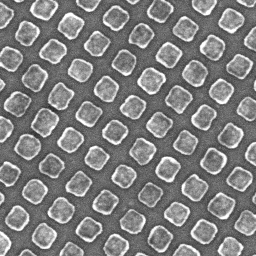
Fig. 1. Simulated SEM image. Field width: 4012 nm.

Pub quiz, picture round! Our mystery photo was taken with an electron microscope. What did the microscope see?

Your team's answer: a regular array of raised bodies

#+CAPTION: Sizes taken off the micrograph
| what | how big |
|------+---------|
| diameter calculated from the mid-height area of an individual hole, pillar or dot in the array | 0.36 microns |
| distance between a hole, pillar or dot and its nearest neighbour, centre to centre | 483 nanometres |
